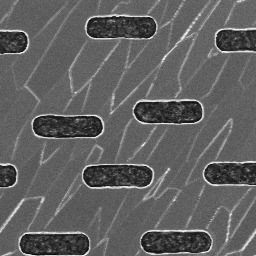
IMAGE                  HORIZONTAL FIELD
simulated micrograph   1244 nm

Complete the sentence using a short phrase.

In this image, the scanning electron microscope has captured holes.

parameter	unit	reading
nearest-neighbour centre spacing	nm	400